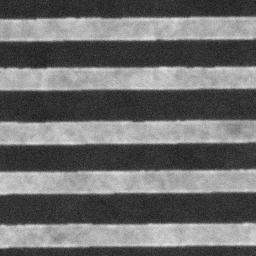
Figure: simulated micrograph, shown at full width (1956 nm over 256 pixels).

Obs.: lines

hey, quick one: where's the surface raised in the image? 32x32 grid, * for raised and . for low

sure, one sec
................................
................................
.....***************************
********************************
********************************
................................
................................
................................
............................****
********************************
********************************
................................
................................
................................
................................
********************************
********************************
********************************
................................
................................
................................
................****************
********************************
********************************
................................
................................
................................
................................
********************************
********************************
********************************
................................